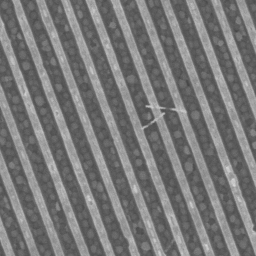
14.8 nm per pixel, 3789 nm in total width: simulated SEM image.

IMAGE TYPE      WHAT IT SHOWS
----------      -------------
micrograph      parallel lines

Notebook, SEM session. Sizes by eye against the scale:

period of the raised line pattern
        0.347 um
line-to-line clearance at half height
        234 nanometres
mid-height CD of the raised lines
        116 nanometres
